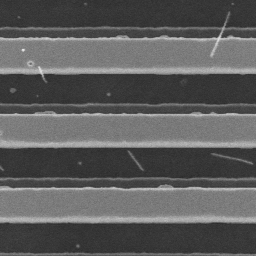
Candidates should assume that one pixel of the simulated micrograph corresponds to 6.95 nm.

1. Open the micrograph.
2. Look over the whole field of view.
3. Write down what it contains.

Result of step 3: lines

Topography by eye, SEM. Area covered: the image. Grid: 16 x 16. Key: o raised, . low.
................
................
oooooooooooooooo
oooooooooooooooo
oooooooooooooooo
................
................
oooooooooooooooo
oooooooooooooooo
................
................
................
oooooooooooooooo
oooooooooooooooo
................
................